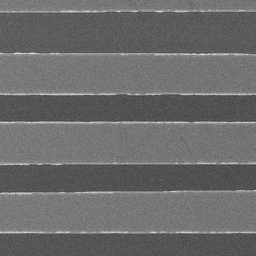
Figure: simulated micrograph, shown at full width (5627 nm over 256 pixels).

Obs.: lines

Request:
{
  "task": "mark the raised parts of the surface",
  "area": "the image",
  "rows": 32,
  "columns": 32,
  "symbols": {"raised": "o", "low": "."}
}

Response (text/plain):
oooooooooooooooooooooooooooooooo
................................
................................
................................
................................
................................
................................
oooooooooooooooooooooooooooooooo
oooooooooooooooooooooooooooooooo
oooooooooooooooooooooooooooooooo
oooooooooooooooooooooooooooooooo
oooooooooooooooooooooooooooooooo
................................
................................
................................
oooooooooooooooooooooooooooooooo
oooooooooooooooooooooooooooooooo
oooooooooooooooooooooooooooooooo
oooooooooooooooooooooooooooooooo
oooooooooooooooooooooooooooooooo
ooooo.oo........................
................................
................................
................................
oooooooooooooooooooooooooooooooo
oooooooooooooooooooooooooooooooo
oooooooooooooooooooooooooooooooo
oooooooooooooooooooooooooooooooo
oooooooooooooooooooooooooooooooo
................................
................................
................................